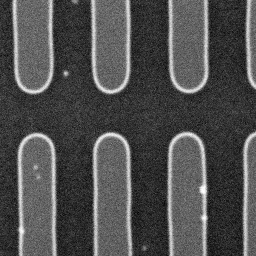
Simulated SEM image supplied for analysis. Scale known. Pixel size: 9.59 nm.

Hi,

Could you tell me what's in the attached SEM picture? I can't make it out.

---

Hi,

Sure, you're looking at groups of lines, slits or small figures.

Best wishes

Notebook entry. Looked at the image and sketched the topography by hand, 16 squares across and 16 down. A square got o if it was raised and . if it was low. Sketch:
.oo...oo...oo..o
.oo...oo...oo..o
.oo...oo...oo..o
.oo...oo...oo..o
.oo...oo...oo...
.oo...oo...o....
................
................
..o........o....
.oo...oo...oo..o
.oo...oo...oo..o
.oo...oo...oo..o
.oo...oo...oo..o
.oo...oo...oo..o
.oo...oo...oo..o
.oo...oo...oo..o